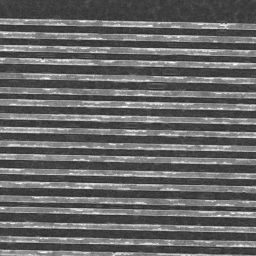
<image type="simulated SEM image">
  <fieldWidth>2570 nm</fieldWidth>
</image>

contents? parallel lines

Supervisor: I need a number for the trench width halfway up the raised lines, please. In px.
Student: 8.13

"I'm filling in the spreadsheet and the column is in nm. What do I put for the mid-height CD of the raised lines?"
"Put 57.7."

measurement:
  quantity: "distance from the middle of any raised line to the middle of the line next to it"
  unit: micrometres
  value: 0.137